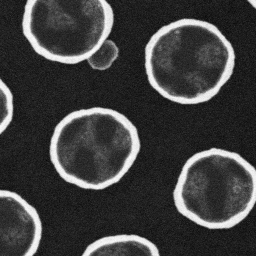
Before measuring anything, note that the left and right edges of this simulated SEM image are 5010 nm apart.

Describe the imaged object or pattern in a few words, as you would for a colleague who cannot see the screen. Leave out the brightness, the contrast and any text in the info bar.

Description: raised bodies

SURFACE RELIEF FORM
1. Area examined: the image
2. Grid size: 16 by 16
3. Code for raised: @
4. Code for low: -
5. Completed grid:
--@@@@@---------
--@@@@@----@@---
--@@@@----@@@@--
---@@----@@@@@--
---------@@@@@--
----------@@@@--
@---------------
----@@@@--------
---@@@@@--------
---@@@@@--------
----@@@@----@@@@
-----@@----@@@@@
@----------@@@@@
@@----------@@@-
@@--------------
@@----@@@-------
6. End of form